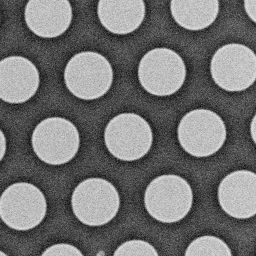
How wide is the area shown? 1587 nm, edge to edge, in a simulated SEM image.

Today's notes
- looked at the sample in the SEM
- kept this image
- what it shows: an array of small figures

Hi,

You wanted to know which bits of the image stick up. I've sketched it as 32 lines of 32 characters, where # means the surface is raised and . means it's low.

...######...######...######....#
...######...######...######....#
...######....#####....#####.....
....####.....####......##.......
.....##.........................
................................
...................###.....####.
###......####.....#####....#####
####....######...######...######
#####...######...######....#####
#####...######....#####....####.
####.....####......###..........
.##.............................
................................
...............##......####.....
.....####.....####.....#####...#
....######...######...######...#
#...######...######...######....
#...######....#####....####.....
.....####.....####..............
................................
..............................#.
...........##......####.....####
.###......####....######...#####
#####....######...######...#####
######...######...######....####
######...######....####.....####
#####.....####......##..........
..##............................
................................
...............###......####....
......####....#####....######...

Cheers